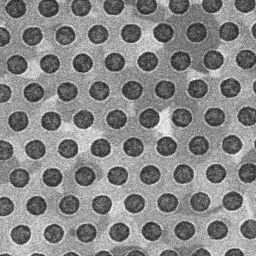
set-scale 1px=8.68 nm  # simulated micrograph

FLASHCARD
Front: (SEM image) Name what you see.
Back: a regular array of holes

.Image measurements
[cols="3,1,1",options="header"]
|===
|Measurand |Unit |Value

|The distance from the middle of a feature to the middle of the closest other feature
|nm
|280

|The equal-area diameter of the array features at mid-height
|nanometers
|182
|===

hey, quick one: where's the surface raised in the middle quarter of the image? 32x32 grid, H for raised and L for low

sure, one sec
HHLLLLLHHHLLLLLHHHLLLLLHHHHLLLLL
HHHLLLLHHHHLLLHHHHHHLLLHHHHHLLHH
HHHHHHHHHHHHHHHHHHHHHHHHHHHHHHHH
HHHHHHHHHHHHHHHHHHHHHHHHHHHHHHHH
LHHHHHHHLLHHHHHHLLLHHHHHLLLHHHHL
LLLHHHLLLLLHHHHLLLLLHHHLLLLLHHHL
LLLLHHLLLLLLHHLLLLLLHHHLLLLLHHHL
LLLLHHLLLLLHHHLLLLLLHHHLLLLLHHHL
LLLHHHHLLLLHHHHLLLLHHHHHLLLHHHHH
LHHHHHHHHHHHHHHHHHHHHHHHHHHHHHHH
HHHHHHHHHHHHHHHHHHHHHHHHHHHHHHHH
HHHHLLHHHHHHLLLHHHHHLLLHHHHLLLLH
HHHLLLLHHHHLLLLLHHHLLLLLHHHLLLLL
HHLLLLLLHHLLLLLLHHHLLLLLHHHLLLLL
HHLLLLLHHHHLLLLLHHHLLLLLHHHLLLLL
HHHLLLLHHHHLLLLHHHHHLLLHHHHHLLLH
HHHHLHHHHHHHHHHHHHHHHHHHHHHHHHHH
HHHHHHHHHHHHHHHHHHHHHHHHHHHHHHHH
HHHHHHHHLLHHHHHHLLLHHHHHLLLHHHHH
LLLHHHHLLLLHHHHLLLLLHHHLLLLLHHHL
LLLLHHHLLLLLHHLLLLLLHHHLLLLLHHHL
LLLLHHLLLLLLHHHLLLLLHHHLLLLLHHHL
LLLHHHHLLLLLHHHLLLLHHHHHLLLHHHHH
LLHHHHHHHLHHHHHHHHHHHHHHHHHHHHHH
HHHHHHHHHHHHHHHHHHHHHHHHHHHHHHHH
HHHHHLHHHHHHHLHHHHHHLLLHHHHHLLLH
HHHLLLLHHHHLLLLLHHHLLLLLHHHHLLLL
HHHLLLLLHHHLLLLLHHHLLLLLHHHLLLLL
HHHLLLLLHHHLLLLLHHHLLLLLHHHLLLLL
HHHLLLLHHHHLLLLHHHHLLLLHHHHHLLLL
HHHHHLHHHHHHHLHHHHHHHHHHHHHHHHHH
HHHHHHHHHHHHHHHHHHHHHHHHHHHHHHHH